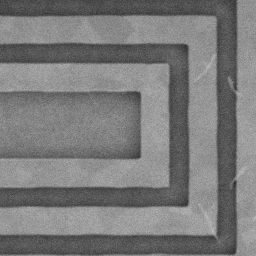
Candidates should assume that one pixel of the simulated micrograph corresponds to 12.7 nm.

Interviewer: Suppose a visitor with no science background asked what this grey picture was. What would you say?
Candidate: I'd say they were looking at groups of lines, slits or small figures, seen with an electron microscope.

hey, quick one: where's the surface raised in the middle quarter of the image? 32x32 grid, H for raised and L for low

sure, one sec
HHHHHHHHHHHHHHHHHHHHHHHHHHLLLLLH
HHHHHHHHHHHHHHHHHHHHHHHHHHLLLLLH
HHHHHHHHHHHHHHHHHHHHHHHHHHLLLLLH
HHHHHHHHHHHHHHHHHHHHHHHHHHLLLLLH
HHHHHHHHHHHHHHHHHHHHHHHHHHLLLLLH
HHHHHHHHHHHHHHHHHHHHHHHHHHLLLLLH
HHHHHHHHHHHHHHHHHHHHHHHHHHLLLLLH
LLLLLLLLLLLLLLLLLLLHHHHHHHLLLLLH
LLLLLLLLLLLLLLLLLLLHHHHHHHLLLLLH
LLLLLLLLLLLLLLLLLLLHHHHHHHLLLLLH
LLLLLLLLLLLLLLLLLLLHHHHHHHLLLLLH
LLLLLLLLLLLLLLLLLLLHHHHHHHLLLLLH
LLLLLLLLLLLLLLLLLLLHHHHHHHLLLLLH
LLLLLLLLLLLLLLLLLLLHHHHHHHLLLLLH
LLLLLLLLLLLLLLLLLLLHHHHHHHLLLLLH
LLLLLLLLLLLLLLLLLLLHHHHHHHLLLLLH
LLLLLLLLLLLLLLLLLLLHHHHHHHLLLLLH
LLLLLLLLLLLLLLLLLLLHHHHHHHLLLLLH
LLLLLLLLLLLLLLLLLLLHHHHHHHLLLLLH
LLLLLLLLLLLLLLLLLLLHHHHHHHLLLLLH
LLLLLLLLLLLLLLLLLLLHHHHHHHLLLLLH
LLLLLLLLLLLLLLLLLLLHHHHHHHLLLLLL
LLLLLLLLLLLLLLLLLLLHHHHHHHLLLLLL
LLLLLLLLLLLLLLLLLLLHHHHHHHLLLLLL
HHHHHHHHHHHHHHHHHHHHHHHHHHLLLLLL
HHHHHHHHHHHHHHHHHHHHHHHHHHLLLLLL
HHHHHHHHHHHHHHHHHHHHHHHHHHLLLLLL
HHHHHHHHHHHHHHHHHHHHHHHHHHLLLLLL
HHHHHHHHHHHHHHHHHHHHHHHHHHLLLLLL
HHHHHHHHHHHHHHHHHHHHHHHHHHLLLLLH
HHHHHHHHHHHHHHHHHHHHHHHHHHLLLLLH
LLLLLLLLLLLLLLLLLLLLLLLLLLLLLLLH